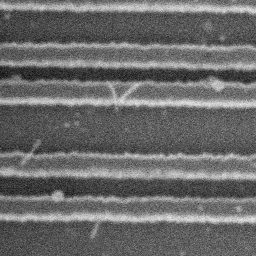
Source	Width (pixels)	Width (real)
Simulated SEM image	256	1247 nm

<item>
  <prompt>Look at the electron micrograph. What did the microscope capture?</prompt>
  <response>lines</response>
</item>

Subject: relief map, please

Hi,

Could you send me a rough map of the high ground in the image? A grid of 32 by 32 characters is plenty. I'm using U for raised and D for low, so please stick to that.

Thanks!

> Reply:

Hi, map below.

UUUUUUUUUUUUUUUUUUUUUUUUUUUUUUUU
DDDDDDDDDDDDDDDDDDDDDDDDDDDDDDDU
DDDDDDDDDDDDDDDDDDDDDDDDDDDDDDDD
DDDDDDDDDDDDDDDDDDDDDDDDDDDDDDDD
DDDDDDDDDDDDDDDDDDDDDDDDDDDDDDDD
DUDUDDUDDUDDDDDUDDDDDDDDDDDDDDDD
UUUUUUUUUUUUUUUUUUUUUUUUUUUUUUUU
UUUUUUUUUUUUUUUUUUUUUUUUUUUUUUUU
DDDDDDDDDDDDDDDDDDDDDDDUUUUUUUUU
DDDDDDDDDDDDDDDDDDDDDDDDDDDDDDDD
UUUUUUUUUUUUUUUUUUUUUUUUUUUUUUDD
UUUUUUUUUUUUUUUUUUUUUUUUUUUUUUUU
UUUUUUUUUUUUUUUUUUUUUUUUUUUUUUUU
DDDDDDDDDDDDDDDDDDDDDDDDDDDDDDDD
DDDDDDDDDDDDDDDDDDDDDDDDDDDDDDDD
DDDDDDDDDDDDDDDDDDDDDDDDDDDDDDDD
DDDDDDDDDDDDDDDDDDDDDDDDDDDDDDDD
DDDDDDDDDDDDDDDDDDDDDDDDDDDDDDDD
DDDDDDDDDDDDDDDDDDDDDDDDDDDDDDDD
UUUUUUUUUUUUUUUUUUUUDUUDDUUDUUDU
UUUUUUUUUUUUUUUUUUUUUUUUUUUUUUUU
UUUUUUUUUUUUUUUUUUUUUUUUUUUUUUUU
DDDDDDDDDDDDDDDDDDDDDDDDDDDDDDDD
DDDDDDDDDDDDDDDDDDDDDDDDDDDDDDDD
DDDDDDUUDDDDDDDDDDDDDDDDDDDDDDDD
UUUUUUUUUUUUUUUUUUUUUUUUUUUUUUUU
UUUUUUUUUUUUUUUUUUUUUUUUUUUUUUUU
DDUDDDDDDDDDDDDDUUUUDDUUUUUUUUUU
DDDDDDDDDDDDDDDDDDDDDDDDDDDDDDDD
DDDDDDDDDDDDDDDDDDDDDDDDDDDDDDDD
DDDDDDDDDDDDDDDDDDDDDDDDDDDDDDDD
DDDDDDDDDDDDDDDDDDDDDDDDDDDDDDDD